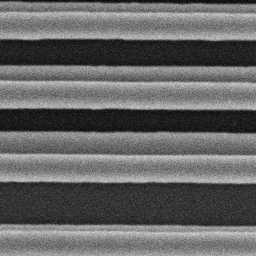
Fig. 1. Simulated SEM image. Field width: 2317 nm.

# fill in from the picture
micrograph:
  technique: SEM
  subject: lines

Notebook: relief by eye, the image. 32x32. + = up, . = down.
+++++++++++++..+++..............
++++++++++++++++++++++++++++++++
++++++++++++++++++++++++++++++++
++++++++++++++++++++++++++++++++
++++++++++++++++++++++++++++++++
................................
................................
................................
++++++++++++++++++++++++++++++++
++++++++++++++++++++++++++++++++
++++++++++++++++++++++++++++++++
++++++++++++++++++++++++++++++++
++++++++++++++++++++++++++++++++
++++++++++++++++++++++++++++++++
................................
................................
................................
++++++++++++++++++++++++++++++++
++++++++++++++++++++++++++++++++
++++++++++++++++++++++++++++++++
++++++++++++++++++++++++++++++++
++++++++++++++++++++++++++++++++
++++++++++++++++++++++++++++++++
................................
................................
................................
................................
................................
++++++++++++++++++++++++++++++++
++++++++++++++++++++++++++++++++
++++++++++++++++++++++++++++++++
++++++++++++++++++++++++++++++++